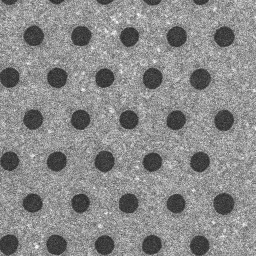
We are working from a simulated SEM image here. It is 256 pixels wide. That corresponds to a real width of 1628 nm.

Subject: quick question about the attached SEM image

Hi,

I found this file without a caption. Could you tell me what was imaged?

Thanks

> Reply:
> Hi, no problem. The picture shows a regular array of holes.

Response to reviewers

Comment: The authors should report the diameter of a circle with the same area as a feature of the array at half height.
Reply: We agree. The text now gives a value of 129 nanometres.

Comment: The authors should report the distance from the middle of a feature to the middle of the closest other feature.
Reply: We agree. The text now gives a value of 303 nm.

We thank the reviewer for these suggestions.